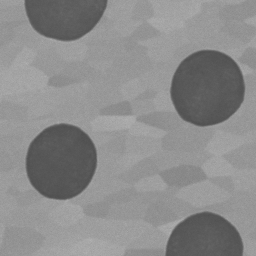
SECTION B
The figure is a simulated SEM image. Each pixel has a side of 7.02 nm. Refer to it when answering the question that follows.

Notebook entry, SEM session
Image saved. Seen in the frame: holes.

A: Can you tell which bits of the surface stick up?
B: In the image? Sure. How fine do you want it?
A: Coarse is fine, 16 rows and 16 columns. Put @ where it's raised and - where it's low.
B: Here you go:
@@-----@@@@@@@@@
@@----@@@@@@@@@@
@@@@-@@@@@@@@@@@
@@@@@@@@@@@@--@@
@@@@@@@@@@@----@
@@@@@@@@@@@----@
@@@@@@@@@@@----@
@@@@@@@@@@@@--@@
@@---@@@@@@@@@@@
@@----@@@@@@@@@@
@@----@@@@@@@@@@
@@----@@@@@@@@@@
@@@@@@@@@@@@@@@@
@@@@@@@@@@@@--@@
@@@@@@@@@@@----@
@@@@@@@@@@-----@